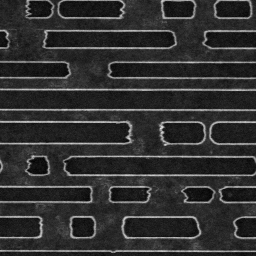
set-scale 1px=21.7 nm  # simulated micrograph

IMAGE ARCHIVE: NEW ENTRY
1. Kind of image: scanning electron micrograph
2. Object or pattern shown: parallel lines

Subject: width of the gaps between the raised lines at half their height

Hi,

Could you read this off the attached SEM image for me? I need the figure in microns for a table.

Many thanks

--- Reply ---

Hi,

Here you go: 0.396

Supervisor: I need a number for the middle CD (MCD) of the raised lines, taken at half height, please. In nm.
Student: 295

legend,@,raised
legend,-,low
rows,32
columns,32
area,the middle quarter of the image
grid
-@@@@@@@@@@---------------------
-@@@@@@@@@@@--------------------
-@@@@@@@@@@---------------------
@@@@@@@@@@@@@@@@@@@@@@@@@@@@----
@@@@@@@@@@@@@@@@@@@@@@@@@@@@@@@@
@@@@@@@@@@@@@@@@@@@@@@@@@@@@@@@@
--------------------------------
--------------------------------
--------------------------------
--------------------------------
--------------------------------
@@@@@@@@@@@@@@@@@@@@@@@@@@@@@@@@
@@@@@@@@@@@@@@@@@@@@@@@@@@@@@@@@
@@@@@@@@@@@@@@@@@@@@@@@@@@@@@@@@
-------------@-@@@@@@@@@@@------
-----------------@@@@@@@@-------
----------------@@@@@@@@@-------
----------------@@@@@@@@@-------
----------------@@@@@@@@@-------
----------------@@@@@@@@@-------
@@@@@@@@@@@@@@@@@@@@@@@@@@@@@@@@
@@@@@@@@@@@@@@@@@@@@@@@@@@@@@@@@
@@@@@@@@@@@@@@@@@@@@@@@@@@@@@@@@
@-------------------------------
--------------------------------
--------------------------------
--------------------------------
@-------------------------------
@@@@@@@@@@@@@@@@@@@@@@@@@@@@@@@@
@@@@@@@@@@@@@@@@@@@@@@@@@@@@@@@@
@@@@@@@@@@@@@@@@@@@@@@@@@@@@@@@@
-------@@@@@---------@@@@@@@@@--